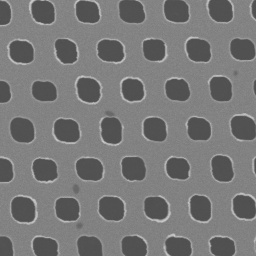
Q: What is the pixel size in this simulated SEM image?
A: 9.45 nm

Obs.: a regular array of holes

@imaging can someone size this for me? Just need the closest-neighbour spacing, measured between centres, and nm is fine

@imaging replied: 417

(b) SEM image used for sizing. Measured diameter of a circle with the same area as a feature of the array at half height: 0.23 microns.